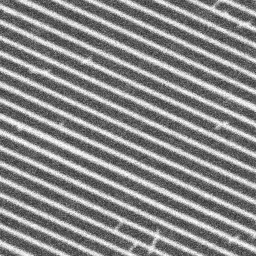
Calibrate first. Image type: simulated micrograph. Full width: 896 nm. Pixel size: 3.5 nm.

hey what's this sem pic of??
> parallel lines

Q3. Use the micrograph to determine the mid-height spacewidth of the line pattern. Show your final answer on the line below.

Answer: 37.3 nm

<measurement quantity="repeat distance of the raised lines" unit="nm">49.9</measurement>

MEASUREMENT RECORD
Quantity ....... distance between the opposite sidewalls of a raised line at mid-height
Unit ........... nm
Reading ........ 12.3